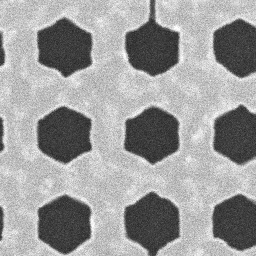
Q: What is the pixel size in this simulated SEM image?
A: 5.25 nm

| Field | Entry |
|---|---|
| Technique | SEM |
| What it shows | holes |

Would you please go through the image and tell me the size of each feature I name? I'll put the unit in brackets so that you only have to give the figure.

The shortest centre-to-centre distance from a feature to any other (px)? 87.8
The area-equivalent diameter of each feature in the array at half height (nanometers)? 292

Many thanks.